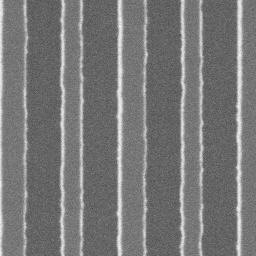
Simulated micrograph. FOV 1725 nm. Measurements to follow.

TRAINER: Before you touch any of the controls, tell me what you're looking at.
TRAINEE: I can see lines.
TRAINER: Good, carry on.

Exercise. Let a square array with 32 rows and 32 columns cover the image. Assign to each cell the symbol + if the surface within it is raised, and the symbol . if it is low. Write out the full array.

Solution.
+++.....++.....+++.....++.....++
+++.....++.....+++.....++.....++
+++.....++.....+++.....++.....++
+++.....++.....+++.....++.....++
+++.....++.....+++.....++.....++
+++.....++.....+++.....++.....++
+++.....++.....+++.....++.....++
+++.....++.....+++.....++.....++
+++.....++.....+++.....++.....++
+++.....++.....+++.....++.....++
+++.....++.....+++.....++.....++
+++.....++.....+++.....++.....++
+++.....++.....+++.....++.....++
+++.....++.....+++.....++.....++
+++.....++.....+++.....++.....++
+++.....++.....+++.....++.....++
+++.....++.....+++.....++.....++
+++.....++.....+++.....++.....++
+++.....++.....+++.....++.....++
+++.....++.....+++.....++.....++
+++.....++.....+++.....++.....++
+++.....++.....+++.....++.....++
+++.....++.....+++.....++.....++
+++.....++.....+++.....++.....++
+++.....++.....+++.....++.....++
+++.....++.....+++.....++.....++
+++.....++.....+++.....++.....++
+++.....++.....+++.....++.....++
+++.....++.....+++.....++.....++
+++.....++.....+++.....++.....++
+++.....++.....+++.....++.....++
+++.....++.....+++.....++.....++